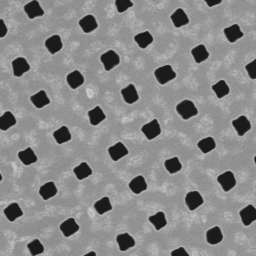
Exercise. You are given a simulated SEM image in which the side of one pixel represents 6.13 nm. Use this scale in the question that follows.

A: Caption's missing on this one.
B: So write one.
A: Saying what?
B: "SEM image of a regular array of holes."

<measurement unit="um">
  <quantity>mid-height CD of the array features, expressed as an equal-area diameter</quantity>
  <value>0.102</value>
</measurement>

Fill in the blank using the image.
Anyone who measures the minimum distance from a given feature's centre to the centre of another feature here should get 243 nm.